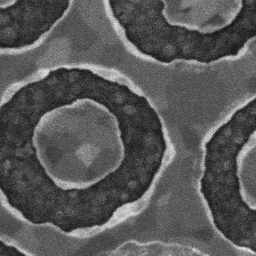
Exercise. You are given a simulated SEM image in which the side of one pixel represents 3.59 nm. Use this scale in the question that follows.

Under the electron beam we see ring-shaped grooves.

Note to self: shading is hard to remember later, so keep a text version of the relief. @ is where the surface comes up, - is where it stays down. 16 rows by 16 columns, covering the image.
----@@@---@@@@@-
---@@@@----@@@--
---@@@@@--------
@@@@@@@@@-----@@
@@@---@@@@@@@@@@
@-------@@@@@@@@
----@@---@@@@@@-
---@@@@---@@@@--
--@@@@@@--@@@---
--@@@@@@---@@--@
---@@@@---@@@--@
----@@----@@@--@
---------@@@@--@
@------@@@@@@---
@@@@@@@@@@@@@@--
-@@@@@@@@@@@@@@-